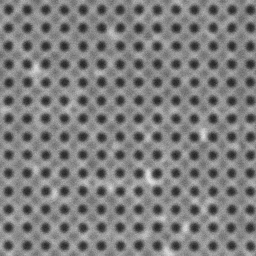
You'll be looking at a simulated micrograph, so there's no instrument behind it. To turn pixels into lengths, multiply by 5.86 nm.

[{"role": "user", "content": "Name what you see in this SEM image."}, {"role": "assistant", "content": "a regular array of holes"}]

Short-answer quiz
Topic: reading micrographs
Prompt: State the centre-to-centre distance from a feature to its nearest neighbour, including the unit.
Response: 105 nanometres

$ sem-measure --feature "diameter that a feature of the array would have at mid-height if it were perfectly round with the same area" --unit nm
70